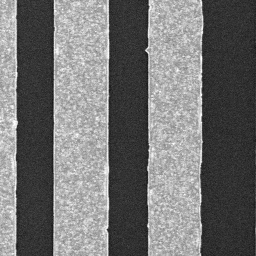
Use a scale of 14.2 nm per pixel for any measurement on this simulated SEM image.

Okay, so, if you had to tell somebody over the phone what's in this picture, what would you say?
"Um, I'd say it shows one or a few lines or trenches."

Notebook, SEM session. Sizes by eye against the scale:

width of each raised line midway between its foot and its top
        753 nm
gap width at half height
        568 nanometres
